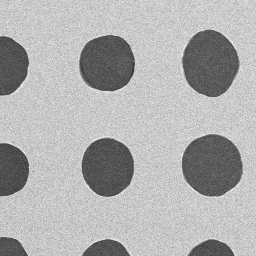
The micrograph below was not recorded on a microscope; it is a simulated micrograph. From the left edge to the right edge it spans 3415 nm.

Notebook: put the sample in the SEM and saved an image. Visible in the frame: holes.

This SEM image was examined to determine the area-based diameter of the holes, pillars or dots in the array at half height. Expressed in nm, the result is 783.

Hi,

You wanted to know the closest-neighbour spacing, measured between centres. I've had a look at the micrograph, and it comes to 1370 nm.